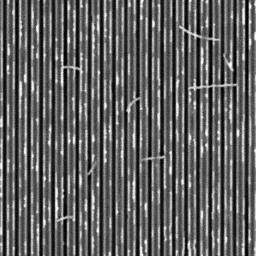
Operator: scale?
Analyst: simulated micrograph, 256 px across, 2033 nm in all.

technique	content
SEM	parallel lines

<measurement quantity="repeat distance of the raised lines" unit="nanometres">96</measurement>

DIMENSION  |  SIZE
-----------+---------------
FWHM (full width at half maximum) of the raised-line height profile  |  58.6 nanometers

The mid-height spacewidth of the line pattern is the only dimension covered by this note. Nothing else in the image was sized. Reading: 0.0367 um